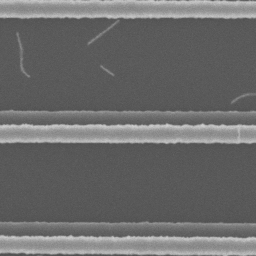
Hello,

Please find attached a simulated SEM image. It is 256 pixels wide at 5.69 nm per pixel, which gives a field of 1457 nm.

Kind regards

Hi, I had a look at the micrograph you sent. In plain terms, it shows lines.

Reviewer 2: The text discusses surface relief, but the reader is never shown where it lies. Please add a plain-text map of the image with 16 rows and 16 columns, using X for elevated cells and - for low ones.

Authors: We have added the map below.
XXXXXXXXXXXXXXXX
----------------
----------------
----------------
----------------
----------------
----------------
XXXXXXXXXXXXXXXX
XXXXXXXXXXXXXXXX
----------------
----------------
----------------
----------------
----------------
XXXXXXXXXXXXXXXX
XXXXXXXXXXXXXXXX